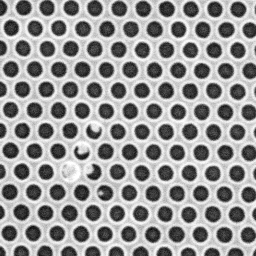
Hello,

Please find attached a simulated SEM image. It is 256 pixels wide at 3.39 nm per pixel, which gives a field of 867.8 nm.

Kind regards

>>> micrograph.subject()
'a regular array of holes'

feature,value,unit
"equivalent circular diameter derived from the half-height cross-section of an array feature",17.6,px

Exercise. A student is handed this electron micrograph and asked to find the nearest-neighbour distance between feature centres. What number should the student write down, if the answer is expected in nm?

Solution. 79.3